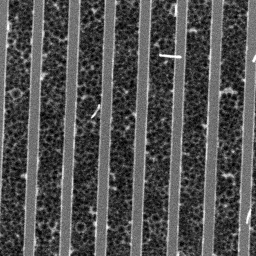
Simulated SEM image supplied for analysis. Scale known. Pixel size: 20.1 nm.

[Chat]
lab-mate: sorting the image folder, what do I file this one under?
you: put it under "parallel lines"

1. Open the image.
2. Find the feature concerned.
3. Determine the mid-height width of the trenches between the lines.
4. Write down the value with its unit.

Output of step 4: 9.74 pixels